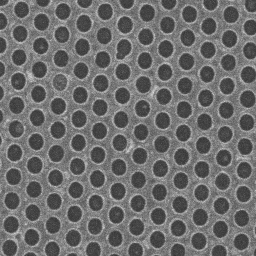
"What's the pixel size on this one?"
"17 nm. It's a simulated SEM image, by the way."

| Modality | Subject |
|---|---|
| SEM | a regular array of holes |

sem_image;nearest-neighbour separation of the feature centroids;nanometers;400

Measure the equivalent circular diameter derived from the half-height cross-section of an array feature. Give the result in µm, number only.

0.282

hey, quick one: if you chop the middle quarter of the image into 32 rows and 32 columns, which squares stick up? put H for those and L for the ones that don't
HHHLLLHHLLLHHLLLHHHLLLHHLLHHHLLL
HHLLLLHHHHHHHLLLLHHHHHHLLLLHHHLH
HHLLLLHHHHHHHLLLLHHHHHHLLLLHHHHH
HHHLLHHHLLLHHLLLHHLLLHHHLLLHHLLH
HHHHHHHLLLLHHHHHHHLLLLHHHHHHHLLL
HHHHHHHLLLLHHHHHHHLLLLHHHHHHLLLL
HHLLLLHHLLLHHLLLHHLLLHHHLLHHHLLL
HHLLLLHHHHHHHLLLLHHHHHHLLLLHHHLH
HHLLLLHHHHHHHLLLLHHHHHHLLLLHHHHH
HHHLLHHHLLHHHLLLHHLLLHHLLLHHHLLH
LHHHHHHLLLLHHHHHHHLLLLHHHHHHLLLL
HHHHHHHLLLLHHHHHHHLLLLHHHHHHLLLL
HHLLLHHHLLHHHLLLHHLLLHHLLLHHLLLL
HHLLLLHHHHHHLLLLHHHHHHHLLLLHHLLH
HHLLLLHHHHHHLLLLHHHHHHHLLLLHHHHH
HHHLLHHLLLHHHLLLHHLLLHHLLLHHHLLH
HHHHHHHLLLLHHHHHHLLLLHHHHHHHLLLL
HHHHHHHLLLLHHHHHHLLLLHHHHHHHLLLL
HHLLLHHHLLHHLLLLHHLLLHHLLLHHLLLH
HHLLLLHHHHHHLLLLHHHHHHHLLLHHHHHH
HHLLLHHHHHHHLLLLHHHHHHLLLLHHHHHH
HHLLLHHLLLHHHLLHHHLLHHHLLLHHLLLH
HHHHHHHLLLHHHHHHHLLLLHHHHHHHLLLH
HHHLHHHLLLHHHHHHHLLLLHHHHHHLLLLH
HHLLLHHLLLHHLLLHHHLLHHHLLHHHLLLH
HLLLLHHHHHHHLLLLHHHHHHLLLLHHHHHH
HLLLLHHHLHHHLLLLHHHHHHLLLLHHHHHH
HHLLHHHLLLHHLLLHHLLLHHLLLLHHLLHH
HHHHHHLLLLHHHHHHHLLLLHHHHHHLLLLH
HHLLHHLLLLHHHHHHHLLLLHHHHHHLLLLH
HLLLLHHLLLHHLLLHHLLLHHHLLHHHLLLH
HLLLLHHHHHHLLLLHHHHHHHLLLLHHHHHH